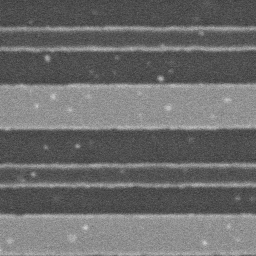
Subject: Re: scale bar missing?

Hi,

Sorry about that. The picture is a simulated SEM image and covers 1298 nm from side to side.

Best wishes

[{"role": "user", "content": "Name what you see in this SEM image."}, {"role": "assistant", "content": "lines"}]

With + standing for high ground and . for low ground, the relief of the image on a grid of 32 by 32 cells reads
................................
................................
................................
.............+++++......+++.....
++++++++++++++++++++++++++++++++
++++++++++++++++++++++++++++++++
................................
................................
................................
................................
................................
++++++++++++++++++++++++++++++++
++++++++++++++++++++++++++++++++
++++++++++++++++++++++++++++++++
++++++++++++++++++++++++++++++++
++++++++++++++++++++++++++++++++
................................
................................
................................
................................
................................
++++++++++++++++++++++++++++++++
++++++++++++++++++++++++++++++++
................................
................................
................................
................................
++++++++++++++++++++++++++++++++
++++++++++++++++++++++++++++++++
++++++++++++++++++++++++++++++++
++++++++++++++++++++++++++++++++
++++++++++++++++++++++++++++++++